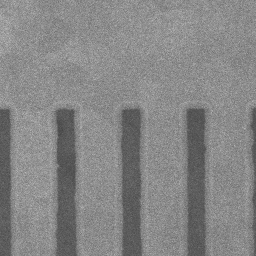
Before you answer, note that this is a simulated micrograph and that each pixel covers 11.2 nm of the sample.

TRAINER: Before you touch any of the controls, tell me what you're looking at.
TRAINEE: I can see one or a few lines or trenches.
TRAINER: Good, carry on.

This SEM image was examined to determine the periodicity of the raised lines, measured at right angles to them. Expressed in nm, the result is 731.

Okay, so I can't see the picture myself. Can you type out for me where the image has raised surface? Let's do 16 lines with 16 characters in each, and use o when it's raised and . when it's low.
oooooooooooooooo
oooooooooooooooo
oooooooooooooooo
oooooooooooooooo
oooooooooooooooo
oooooooooooooooo
oooooooooooooooo
.oo..oo..oo..ooo
.oo..oo..oo..ooo
.oo..oo..oo..oo.
.oo..oo..oo..ooo
.oo..oo..oo..ooo
.oo..oo..oo..ooo
.oo..oo..oo..ooo
.oo..oo..oo..ooo
.oo..oo..oo..ooo